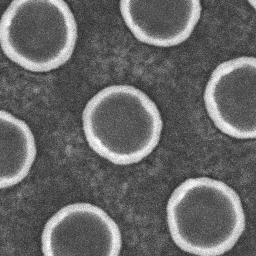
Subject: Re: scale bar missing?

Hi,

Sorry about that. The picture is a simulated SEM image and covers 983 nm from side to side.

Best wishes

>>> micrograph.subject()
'raised bodies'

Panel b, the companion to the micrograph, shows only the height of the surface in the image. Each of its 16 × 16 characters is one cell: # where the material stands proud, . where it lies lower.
.###....####....
#####...####....
#####....##.....
.###............
..............##
.............###
......###....###
#....#####....##
##....####.....#
##....###.......
##..............
............##..
...........####.
....###....####.
...####....####.
...####.....##..